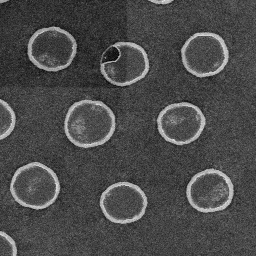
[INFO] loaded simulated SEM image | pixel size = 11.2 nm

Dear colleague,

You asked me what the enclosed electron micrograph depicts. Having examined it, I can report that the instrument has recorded a regular array of raised bodies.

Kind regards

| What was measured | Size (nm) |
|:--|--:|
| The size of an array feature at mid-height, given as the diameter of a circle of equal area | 478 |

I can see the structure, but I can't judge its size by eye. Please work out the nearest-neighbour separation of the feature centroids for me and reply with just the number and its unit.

821 nanometres